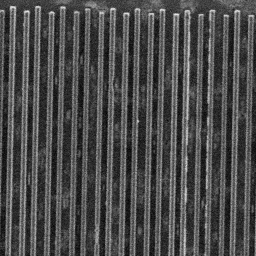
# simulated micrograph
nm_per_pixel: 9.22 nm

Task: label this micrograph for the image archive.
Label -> parallel lines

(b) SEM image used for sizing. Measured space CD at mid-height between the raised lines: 71.5 nm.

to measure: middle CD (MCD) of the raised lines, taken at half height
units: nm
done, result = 40.3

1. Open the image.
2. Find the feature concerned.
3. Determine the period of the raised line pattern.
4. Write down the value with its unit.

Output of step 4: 116 nm